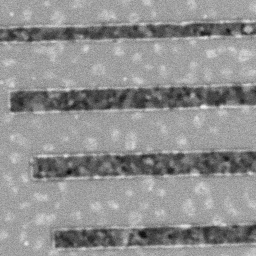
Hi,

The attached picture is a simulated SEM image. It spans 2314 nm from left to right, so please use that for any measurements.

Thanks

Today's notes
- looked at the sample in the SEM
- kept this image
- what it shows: one or a few lines or trenches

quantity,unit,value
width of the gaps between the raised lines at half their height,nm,427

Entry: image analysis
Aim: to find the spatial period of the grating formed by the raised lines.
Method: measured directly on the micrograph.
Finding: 615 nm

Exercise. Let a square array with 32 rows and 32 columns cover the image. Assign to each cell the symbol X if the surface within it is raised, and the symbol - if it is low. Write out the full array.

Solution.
--------------------------------
--------------------------------
--------------------------------
-XXXXXXXXXXXXXXXXXXXXXXXXXXXXXXX
XXXXXXXXXXXXXXXXXXXXXXXXXXXXXX--
--------------------------------
--------------------------------
--------------------------------
--------------------------------
--------------------------------
--------------------------------
-XXXXXXXXXXXXXXXXXXXXXXXXXXXXXXX
-XXXXXXXXXXXXXXXXXXXXXXXXXXXXXXX
-XXXXXXXXXXXXXXXXXXXXXXXX-------
--------------------------------
--------------------------------
--------------------------------
--------------------------------
--------------------------------
--------XXXXXXXXXXXXXXXXXXXXXXXX
----XXXXXXXXXXXXXXXXXXXXXXXXXXXX
----XXXXXXXXXXXXXXXXXXXXXXXXXXXX
--------------------------------
--------------------------------
--------------------------------
--------------------------------
--------------------------------
--------------------------------
------------XXXXXXXXXXXXXXXXXXXX
-------XXXXXXXXXXXXXXXXXXXXXXXXX
-------XXXXXXXXXXXXXXXXXXXXX--XX
--------------------------------